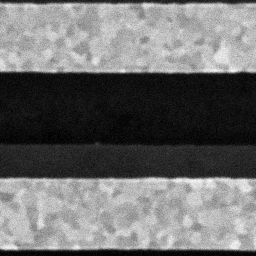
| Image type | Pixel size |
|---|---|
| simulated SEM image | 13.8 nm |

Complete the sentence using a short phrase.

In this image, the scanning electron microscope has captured lines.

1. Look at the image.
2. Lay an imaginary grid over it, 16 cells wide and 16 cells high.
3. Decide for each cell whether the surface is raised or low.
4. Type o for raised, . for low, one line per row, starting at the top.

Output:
oooooooooooooooo
oooooooooooooooo
oooooooooooooooo
oooooooooooooooo
..........oo....
................
................
................
................
oooooooooooooooo
oooooooooooooooo
oooooooooooooooo
oooooooooooooooo
oooooooooooooooo
oooooooooooooooo
oooooooooooooooo